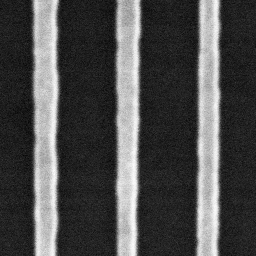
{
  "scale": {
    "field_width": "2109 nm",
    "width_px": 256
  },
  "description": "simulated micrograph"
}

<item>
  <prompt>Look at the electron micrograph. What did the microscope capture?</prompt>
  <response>lines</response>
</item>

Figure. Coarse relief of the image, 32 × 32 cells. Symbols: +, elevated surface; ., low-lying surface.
....+++........++........++.....
....+++........++........++.....
....+++........++........++.....
....+++........++........++.....
....+++........++........++.....
....+++........++........++.....
....+++........++........++.....
....+++........++........++.....
....+++........++........++.....
....+++........++........++.....
....+++........++........++.....
....+++........++........++.....
....+++........++........++.....
....+++........++........++.....
....+++........++........++.....
....+++........++........++.....
....+++........++........++.....
.....++........++........++.....
....+++........++........++.....
....+++........++........++.....
....+++........++........++.....
....+++........++........++.....
....+++........++........++.....
.....++........++........++.....
.....++........++........++.....
.....++........++........++.....
.....++........++........++.....
.....++........++........++.....
.....++........++........++.....
.....++........++........++.....
.....++........++........++.....
.....++........++........++.....